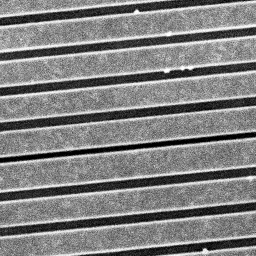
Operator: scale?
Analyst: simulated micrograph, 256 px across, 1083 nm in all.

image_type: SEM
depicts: parallel lines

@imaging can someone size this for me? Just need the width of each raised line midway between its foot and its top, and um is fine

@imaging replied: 0.106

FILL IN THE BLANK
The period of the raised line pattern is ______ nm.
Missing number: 148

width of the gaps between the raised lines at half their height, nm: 40.5